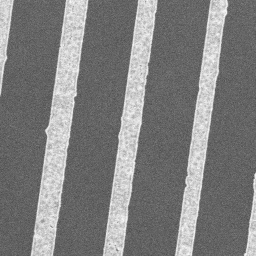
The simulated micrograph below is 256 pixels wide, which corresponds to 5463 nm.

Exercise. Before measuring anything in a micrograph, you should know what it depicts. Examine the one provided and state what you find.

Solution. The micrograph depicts one or a few lines or trenches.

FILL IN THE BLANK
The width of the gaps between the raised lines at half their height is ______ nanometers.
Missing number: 1150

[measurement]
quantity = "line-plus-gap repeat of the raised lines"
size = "1.5 microns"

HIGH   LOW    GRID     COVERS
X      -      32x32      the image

X-------XXX------XXX------XX----
X-------XXX------XX-------XX----
X-------XX-------XX-------XX----
X-------XX-------XX-------XX----
X-------XX-------XX-------XX----
X-------XX-------XX-------XX----
X-------XX-------XX-------X-----
X------XXX------XXX------XX-----
-------XXX------XX-------XX-----
-------XXX------XX-------XX-----
-------XX-------XX-------XX-----
-------XX-------XX-------XX-----
-------XX-------XX-------XX-----
------XXX-------XX-------X------
------XXX------XXX------XX------
------XXX------XX-------XX------
------XXX------XX-------XX------
------XXX------XX-------XX------
------XX-------XX-------XX------
------XX-------XX-------XX------
------XX-------XX-------X-------
-----XXX------XXX-------X-------
-----XXX------XX-------XX-------
-----XXX------XX-------XX-------
-----XXX------XX-------XX-------
-----XX-------XX-------XX-------
-----XX-------XX-------XX-------
-----XX-------XX-------X-------X
----XXX------XXX-------X-------X
----XXX------XX-------XX-------X
----XXX------XX-------XX-------X
----XXX------XX-------XX-------X